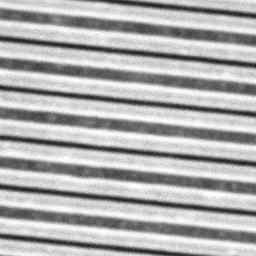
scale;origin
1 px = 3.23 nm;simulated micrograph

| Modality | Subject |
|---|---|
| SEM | parallel lines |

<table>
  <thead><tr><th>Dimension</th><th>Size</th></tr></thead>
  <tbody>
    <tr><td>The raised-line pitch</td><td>80.1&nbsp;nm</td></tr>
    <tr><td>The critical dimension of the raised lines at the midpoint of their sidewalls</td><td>46.1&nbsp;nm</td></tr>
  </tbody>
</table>